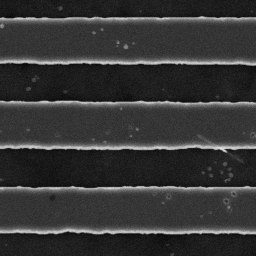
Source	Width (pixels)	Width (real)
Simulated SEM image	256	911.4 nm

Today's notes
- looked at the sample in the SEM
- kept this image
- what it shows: lines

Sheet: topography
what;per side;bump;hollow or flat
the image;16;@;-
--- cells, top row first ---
----------------
@@@@@@@@@@@@@@@@
@@@@@@@@@@@@@@@@
@@@@@@@@@@@@@@@@
----------------
----------------
@@@@@@@@@@@@@@@@
@@@@@@@@@@@@@@@@
@@@@@@@@@@@@@@@@
----------------
----------------
----------------
@@@@@@@@@@@@@@@@
@@@@@@@@@@@@@@@@
@@@@-@@@@@@@@@@@
----------------